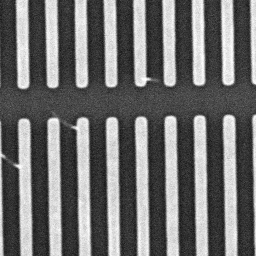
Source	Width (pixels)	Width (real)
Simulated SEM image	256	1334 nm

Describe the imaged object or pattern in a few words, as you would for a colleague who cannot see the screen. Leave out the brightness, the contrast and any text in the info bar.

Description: groups of lines, slits or small figures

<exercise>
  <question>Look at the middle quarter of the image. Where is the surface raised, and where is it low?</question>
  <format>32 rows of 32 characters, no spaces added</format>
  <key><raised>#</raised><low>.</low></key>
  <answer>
...###.....##.....##.....###....
...###.....##.....##.....###....
...###.....##.....##.....###....
...###.....##.....###....###....
...###.....##.....##.....###....
....#...........................
................................
................................
................................
................................
................................
................................
................................
....#......##.....##......##....
...###.....##.....###....###....
...###.....##.....###....###....
...###.....##.....###....###....
...###.....##.....###....###....
...###.....##.....###....###....
...###.....##.....###....###....
...###.....##.....###....###....
...###.....##.....###.....##....
...###.....##.....###.....##....
...###.....##.....###.....##....
...###.....##.....###.....##....
...###.....##.....###.....##....
...###.....##.....###.....##....
....##.....##.....###.....##....
....##.....##.....###.....##....
....##.....##.....###.....##....
....##.....##.....###.....##....
....##.....##.....###.....##....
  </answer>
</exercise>